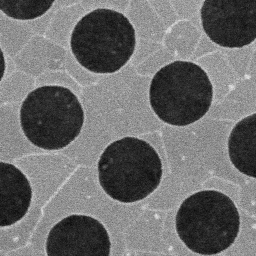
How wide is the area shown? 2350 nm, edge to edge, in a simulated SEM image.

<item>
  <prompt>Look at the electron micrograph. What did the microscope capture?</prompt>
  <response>holes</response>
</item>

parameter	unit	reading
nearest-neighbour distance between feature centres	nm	842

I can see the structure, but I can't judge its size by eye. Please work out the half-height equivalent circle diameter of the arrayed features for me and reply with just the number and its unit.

590 nanometres